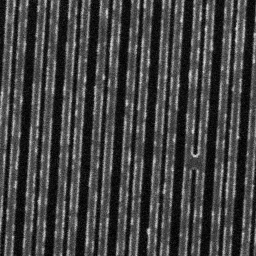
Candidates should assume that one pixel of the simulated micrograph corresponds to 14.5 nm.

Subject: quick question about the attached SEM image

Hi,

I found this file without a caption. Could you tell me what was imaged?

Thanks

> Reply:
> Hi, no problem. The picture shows parallel lines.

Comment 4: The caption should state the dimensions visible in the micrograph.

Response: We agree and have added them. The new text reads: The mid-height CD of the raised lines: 7.86 px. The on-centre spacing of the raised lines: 226 nanometres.